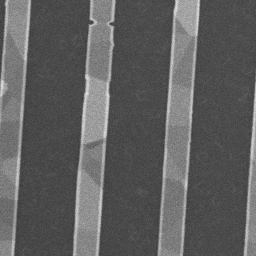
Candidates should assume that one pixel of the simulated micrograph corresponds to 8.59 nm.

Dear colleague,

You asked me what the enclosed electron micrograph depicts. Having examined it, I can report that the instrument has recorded one or a few lines or trenches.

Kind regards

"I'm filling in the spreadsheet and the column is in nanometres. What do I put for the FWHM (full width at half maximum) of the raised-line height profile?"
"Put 197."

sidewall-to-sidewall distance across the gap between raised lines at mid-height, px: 61.4